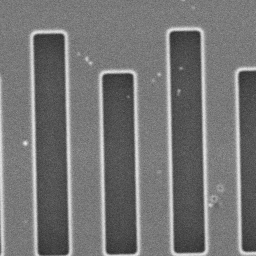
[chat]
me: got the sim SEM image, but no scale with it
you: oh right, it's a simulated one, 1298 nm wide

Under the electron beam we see groups of lines, slits or small figures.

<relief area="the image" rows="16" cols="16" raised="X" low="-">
XXXXXXXXXXXXXXXX
XXXXXXXXXXXXXXXX
XX--XXXXXXX--XXX
XX--XXXXXXX--XXX
XX--XXXXXXX--XX-
XX--XX--XXX--XX-
XX--XX--XXX--XX-
XX--XX--XXX--XX-
XX--XX--XXX--XX-
XX--XX--XXX--XX-
XX--XX--XXX--XX-
XX--XX---XX--XX-
XX--XXX--XX--XX-
XX--XXX--XX--XX-
XX--XXX--XX--XX-
XX--XXX--XX--XX-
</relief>